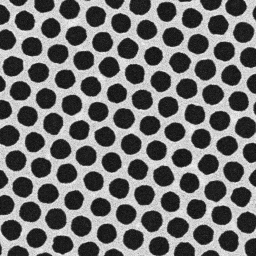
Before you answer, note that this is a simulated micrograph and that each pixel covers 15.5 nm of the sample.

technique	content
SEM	a regular array of holes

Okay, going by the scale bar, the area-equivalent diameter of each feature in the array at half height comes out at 322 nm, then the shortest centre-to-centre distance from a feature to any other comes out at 403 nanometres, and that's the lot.